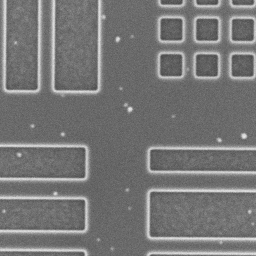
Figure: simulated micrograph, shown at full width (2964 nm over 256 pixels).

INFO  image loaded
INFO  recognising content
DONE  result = groups of lines, slits or small figures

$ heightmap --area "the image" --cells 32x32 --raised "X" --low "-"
X----XX-----XXXXXXXX---XX--XX---
X----XX-----XXXXXXXXXXXXXXXXXXXX
X----XX-----XXXXXXXX---XX--XX---
X----XX-----XXXXXXXX---X---XX---
X----XX-----XXXXXXXX---X---XX---
X----XX-----XXXXXXXXXXXXXXXXXXXX
X----XX-----XXXXXXXXXXXXXXXXXXXX
X----XX-----XXXXXXXX---X---XX---
X----XX-----XXXXXXXX---X---XX---
X----XX-----XXXXXXXX---XX--XX---
X----XX-----XXXXXXXXXXXXXXXXXXXX
XXXXXXXXXXXXXXXXXXXXXXXXXXXXXXXX
XXXXXXXXXXXXXXXXXXXXXXXXXXXXXXXX
XXXXXXXXXXXXXXXXXXXXXXXXXXXXXXXX
XXXXXXXXXXXXXXXXXXXXXXXXXXXXXXXX
XXXXXXXXXXXXXXXXXXXXXXXXXXXXXXXX
XXXXXXXXXXXXXXXXXXXXXXXXXXXXXXXX
XXXXXXXXXXXXXXXXXXXXXXXXXXXXXXXX
----------XXXXXXXXXXXXXXXXXXXXXX
-----------XXXXXXXX-------------
-----------XXXXXXXX-------------
-----------XXXXXXXXXXX----------
XXXXXXXXXXXXXXXXXXXXXXXXXXXXXXXX
XXXXXXXXXXXXXXXXXXXXXXXXXXXXXXXX
XXXXXXXXXXXXXXXXXXX-------------
-----------XXXXXXXX-------------
-----------XXXXXXXX-------------
-----------XXXXXXXX-------------
-----------XXXXXXXX-------------
XXXXXXXXXXXXXXXXXXX-------------
XXXXXXXXXXXXXXXXXXXXXXXXXXXXXXXX
----------XXXXXXXXXXXXXXXXXXXXXX